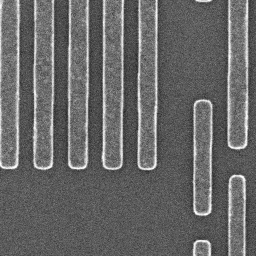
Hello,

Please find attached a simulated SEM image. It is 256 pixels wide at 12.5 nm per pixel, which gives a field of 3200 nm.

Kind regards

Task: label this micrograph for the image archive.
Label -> wiring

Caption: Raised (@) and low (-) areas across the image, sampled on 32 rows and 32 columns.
@@--@@@--@@--@@--@@@---------@@-
@@--@@@--@@--@@--@@@---------@@-
@@--@@@--@@--@@--@@@---------@@-
@@--@@@--@@--@@--@@@---------@@-
@@--@@@--@@--@@--@@@---------@@-
@@--@@@--@@--@@--@@@---------@@-
@@--@@@--@@--@@--@@@---------@@-
@@--@@@--@@--@@--@@@---------@@-
@@--@@@--@@--@@--@@@---------@@-
@@--@@@--@@--@@--@@@---------@@-
@@--@@@--@@--@@--@@@---------@@-
@@--@@@--@@--@@--@@@---------@@-
@@--@@@--@@--@@--@@@---------@@-
@@--@@@--@@--@@--@@@----@@---@@-
@@--@@@--@@--@@--@@-----@@---@@-
@@--@@@--@@--@@--@@-----@@---@@-
@@--@@@--@@--@@--@@-----@@---@@-
@@--@@@--@@--@@--@@-----@@---@@-
@@--@@@--@@--@@--@@-----@@------
@@--@@@--@@--@@--@@-----@@------
@@--@@---@@--@@--@@-----@@------
------------------------@@------
------------------------@@---@--
------------------------@@---@@-
------------------------@@---@@-
------------------------@@---@@-
------------------------@@---@@-
-----------------------------@@-
-----------------------------@@-
-----------------------------@@-
------------------------@@---@@-
------------------------@@---@@-